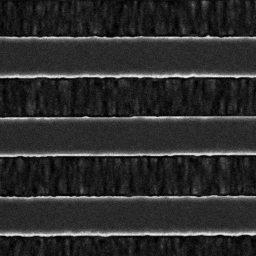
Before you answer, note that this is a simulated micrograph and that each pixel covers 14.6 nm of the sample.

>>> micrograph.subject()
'lines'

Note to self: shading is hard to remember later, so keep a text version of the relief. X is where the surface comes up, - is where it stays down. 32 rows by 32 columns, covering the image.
--------------------------------
--------------------------------
--------------------------------
--------------------------------
--------------------------------
XXXXXXXXXXXXXXXXXXXXXXXXXXXXXXXX
XXXXXXXXXXXXXXXXXXXXXXXXXXXXXXXX
XXXXXXXXXXXXXXXXXXXXXXXXXXXXXXXX
XXXXXXXXXXXXXXXXXXXXXXXXXXXXXXXX
XXXXXXXXXXXXXXXXXXXXXXXXXXXXXXXX
--------------------------------
--------------------------------
--------------------------------
--------------------------------
--------------------------------
XXXXXXXXXXXXXXXXXXXXXXXXXXXXXXXX
XXXXXXXXXXXXXXXXXXXXXXXXXXXXXXXX
XXXXXXXXXXXXXXXXXXXXXXXXXXXXXXXX
XXXXXXXXXXXXXXXXXXXXXXXXXXXXXXXX
XX-XX---------------------------
--------------------------------
--------------------------------
--------------------------------
--------------------------------
--------------------------XX--X-
XXXXXXXXXXXXXXXXXXXXXXXXXXXXXXXX
XXXXXXXXXXXXXXXXXXXXXXXXXXXXXXXX
XXXXXXXXXXXXXXXXXXXXXXXXXXXXXXXX
XXXXXXXXXXXXXXXXXXXXXXXXXXXXXXXX
X-XX-XX--X---X------------------
--------------------------------
--------------------------------